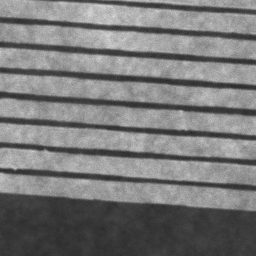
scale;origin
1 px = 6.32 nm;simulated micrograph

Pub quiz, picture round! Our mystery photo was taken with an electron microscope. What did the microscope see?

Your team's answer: parallel lines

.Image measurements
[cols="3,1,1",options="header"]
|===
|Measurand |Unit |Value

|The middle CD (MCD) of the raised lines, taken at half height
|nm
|113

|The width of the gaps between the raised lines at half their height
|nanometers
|44.9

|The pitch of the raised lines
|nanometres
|158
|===